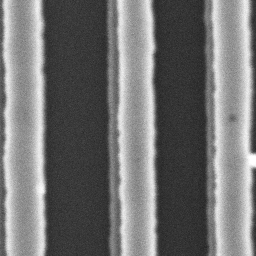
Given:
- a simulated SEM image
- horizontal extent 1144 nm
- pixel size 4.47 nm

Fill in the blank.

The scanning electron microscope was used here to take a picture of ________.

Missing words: lines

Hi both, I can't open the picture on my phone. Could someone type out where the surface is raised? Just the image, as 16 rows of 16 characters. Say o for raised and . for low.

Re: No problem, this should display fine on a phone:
oo.....oo....oo.
ooo....ooo...oo.
oo.....ooo...ooo
ooo....ooo...ooo
ooo....ooo...ooo
ooo....ooo...ooo
ooo....ooo...ooo
ooo....ooo...ooo
ooo....ooo...oo.
ooo....ooo...ooo
ooo....ooo...ooo
ooo....ooo...ooo
ooo....ooo...ooo
ooo....ooo...ooo
ooo....ooo...ooo
ooo....ooo...ooo